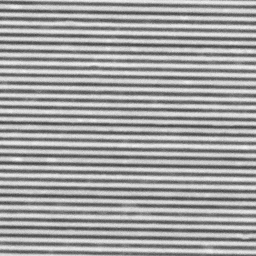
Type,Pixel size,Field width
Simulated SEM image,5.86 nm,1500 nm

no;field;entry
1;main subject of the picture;parallel lines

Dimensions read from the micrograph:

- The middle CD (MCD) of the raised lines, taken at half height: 24.9 nm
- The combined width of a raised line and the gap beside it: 0.0471 microns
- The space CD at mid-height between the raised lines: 0.0256 um